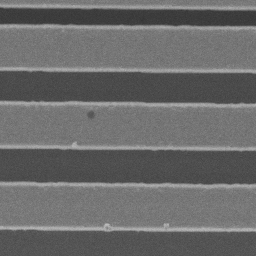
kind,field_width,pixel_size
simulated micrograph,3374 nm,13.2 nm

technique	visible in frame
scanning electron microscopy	lines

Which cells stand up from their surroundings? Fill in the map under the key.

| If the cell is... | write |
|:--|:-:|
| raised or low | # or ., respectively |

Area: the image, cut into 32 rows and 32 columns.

################################
................................
................................
################################
################################
################################
################################
################################
################################
................................
................................
................................
................................
################################
################################
################################
################################
################################
################################
................................
................................
................................
................................
################################
################################
################################
################################
################################
################################
................................
................................
................................